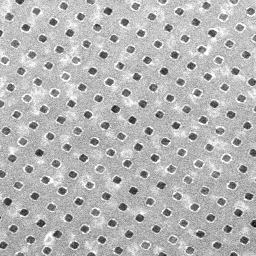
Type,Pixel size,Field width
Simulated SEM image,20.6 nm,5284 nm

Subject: a regular array of raised bodies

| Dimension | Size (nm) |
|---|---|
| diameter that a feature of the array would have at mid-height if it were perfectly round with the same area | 189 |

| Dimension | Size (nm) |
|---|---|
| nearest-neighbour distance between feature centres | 400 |